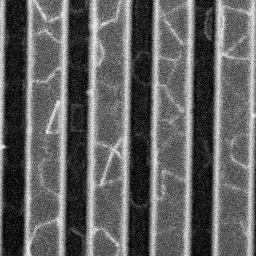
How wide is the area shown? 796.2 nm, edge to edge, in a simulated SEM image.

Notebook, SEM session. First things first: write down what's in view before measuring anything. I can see parallel lines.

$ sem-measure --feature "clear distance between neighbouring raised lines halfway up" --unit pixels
25.2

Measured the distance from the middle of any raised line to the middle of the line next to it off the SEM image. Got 195 nm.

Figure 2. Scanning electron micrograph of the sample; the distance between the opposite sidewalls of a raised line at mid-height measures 37.4 pixels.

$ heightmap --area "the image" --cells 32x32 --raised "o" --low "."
....oooo....oooo...ooooo...ooooo
....oooo....oooo...ooooo...ooooo
....oooo....oooo...ooooo...ooooo
....oooo...ooooo...ooooo...ooooo
....oooo....oooo...ooooo...ooooo
....oooo...ooooo...ooooo...ooooo
....oooo...ooooo...ooooo...ooooo
....oooo....oooo...ooooo...ooooo
....oooo....oooo...ooooo...ooooo
....oooo....oooo...ooooo...ooooo
....oooo...ooooo...ooooo...ooooo
....oooo...ooooo...ooooo...ooooo
....oooo...ooooo...ooooo...ooooo
....oooo...ooooo...ooooo...ooooo
...ooooo...ooooo...ooooo...ooooo
...ooooo...ooooo...ooooo...ooooo
...ooooo...ooooo...ooooo...ooooo
...ooooo...ooooo...ooooo...ooooo
...ooooo...ooooo...ooooo...ooooo
...ooooo...ooooo...ooooo...ooooo
...ooooo...ooooo...ooooo...ooooo
...ooooo...ooooo...ooooo...ooooo
...ooooo...ooooo...ooooo...ooooo
...ooooo...ooooo...ooooo...ooooo
...ooooo...ooooo...ooooo...oooo.
...ooooo...ooooo...ooooo...oooo.
...ooooo...ooooo...ooooo...oooo.
...ooooo...ooooo...ooooo...oooo.
...ooooo...ooooo...ooooo...oooo.
...ooooo...ooooo...ooooo...oooo.
...ooooo...ooooo...ooooo...oooo.
...ooooo...ooooo...ooooo...oooo.